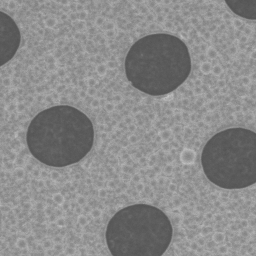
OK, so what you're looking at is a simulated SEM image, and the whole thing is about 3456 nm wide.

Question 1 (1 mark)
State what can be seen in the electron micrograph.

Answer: holes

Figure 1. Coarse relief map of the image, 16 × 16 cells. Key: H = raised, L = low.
HHHHHHHHHHHHHHLL
LHHHHHHHHHHHHHHH
LHHHHHHHHLLHHHHH
LHHHHHHHLLLLHHHH
HHHHHHHHLLLLHHHH
HHHHHHHHHLLHHHHH
HHHHHHHHHHHHHHHH
HHLLLLHHHHHHHHHH
HHLLLLHHHHHHHLLL
HHLLLLHHHHHHHLLL
HHHHHHHHHHHHHLLL
HHHHHHHHHHHHHLLL
HHHHHHHHHHHHHHHH
HHHHHHHLLLHHHHHH
HHHHHHHLLLLHHHHH
HHHHHHHLLLHHHHHH